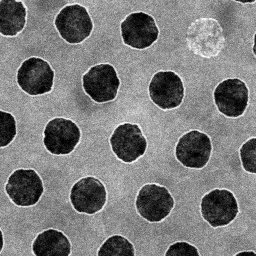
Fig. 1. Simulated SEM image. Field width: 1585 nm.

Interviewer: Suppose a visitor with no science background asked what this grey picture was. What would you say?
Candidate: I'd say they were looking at a regular array of holes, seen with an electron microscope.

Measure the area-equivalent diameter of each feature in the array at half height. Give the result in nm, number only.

234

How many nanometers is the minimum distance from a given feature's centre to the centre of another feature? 399